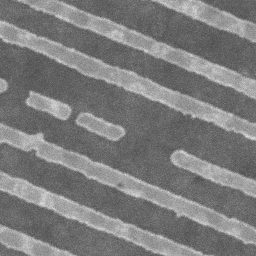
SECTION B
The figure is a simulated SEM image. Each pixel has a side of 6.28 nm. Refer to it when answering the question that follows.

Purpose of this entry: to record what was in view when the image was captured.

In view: parallel lines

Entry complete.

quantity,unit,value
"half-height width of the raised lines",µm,0.0916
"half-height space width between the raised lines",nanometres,189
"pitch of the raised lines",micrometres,0.289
